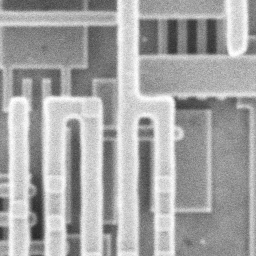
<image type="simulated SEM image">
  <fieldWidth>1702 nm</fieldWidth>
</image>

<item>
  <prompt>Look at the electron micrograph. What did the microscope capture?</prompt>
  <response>wiring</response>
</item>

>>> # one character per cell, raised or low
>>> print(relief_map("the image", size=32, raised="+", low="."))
...............++...........+++.
...............++...........+++.
...............++...........+++.
...............++...........+++.
...............++...........+++.
...............++...........+++.
...............++............+..
...............++...............
...............++...............
...............++...............
...............++...............
...............++...............
.++...++++++...+++++++..........
.++...+++++++..+++++++..........
.++...+++++++..+++++++..........
.++...++..+++..++..+++..........
.++...++..+++..++..+++..........
.++...++..+++..++..+++..........
.++...++..+++..++..+++..........
.++...++..+++..++..+++..........
.++...++..+++..++..+++..........
.++...++..+++..++..+++..........
.++...++..+++..++..+++..........
.++...++..+++..++..+++..........
.++...++..+++..++..+++..........
.++...++..+++..++..+++..........
.++...++..+++..++..+++..........
.++...++..+++..++..+++..........
.+++..++..+++..++..+++..........
.+++..++..+++..++..+++..........
.+++..++..+++..++..+++..........
.++...++..+++..++..+++..........